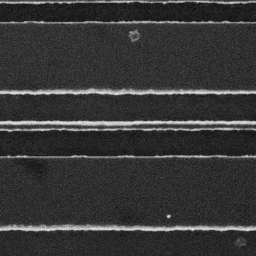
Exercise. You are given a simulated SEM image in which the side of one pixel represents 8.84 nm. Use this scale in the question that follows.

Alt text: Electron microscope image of lines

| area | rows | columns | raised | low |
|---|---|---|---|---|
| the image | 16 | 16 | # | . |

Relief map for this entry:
................
################
################
################
################
################
................
................
................
................
################
################
################
################
................
................